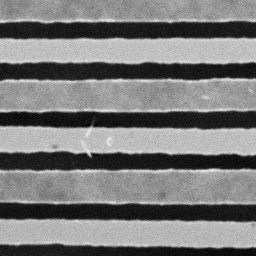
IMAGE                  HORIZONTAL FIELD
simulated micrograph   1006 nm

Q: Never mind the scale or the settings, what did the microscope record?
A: lines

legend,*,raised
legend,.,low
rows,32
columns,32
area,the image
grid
********************************
********************************
********************************
................................
................................
********************************
********************************
********************************
................................
................................
********************************
********************************
********************************
********************************
................................
................................
********************************
********************************
********************************
................................
................................
********************************
********************************
********************************
********************************
....................*..*..*.....
................................
*..*..**........................
********************************
********************************
********************************
................................